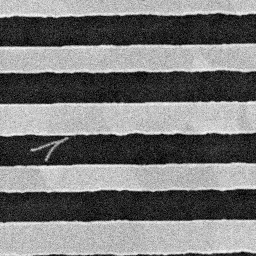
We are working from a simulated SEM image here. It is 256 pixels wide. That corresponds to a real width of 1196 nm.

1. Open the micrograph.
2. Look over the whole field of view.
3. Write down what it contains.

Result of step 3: lines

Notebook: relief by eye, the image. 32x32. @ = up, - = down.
@@@@@@@@@@@@@@@@@@@@@@@@@@@@@@@@
@@@@@@@@@@@@@@@@@@@@@@@@@@@@@@@@
--------------------------------
--------------------------------
--------------------------------
--------------------------------
@@@@@@@@@@@@@@@@@@@@@@@@@@@@@@@@
@@@@@@@@@@@@@@@@@@@@@@@@@@@@@@@@
@@@@@@@@@@@@@@@@@@@@@@@@@@@@@@@@
--------------------------------
--------------------------------
--------------------------------
--------------------------------
@@@@@@@@@@@@@@@@@@@@@@@@@@@@@@@@
@@@@@@@@@@@@@@@@@@@@@@@@@@@@@@@@
@@@@@@@@@@@@@@@@@@@@@@@@@@@@@@@@
@@@@@@@@@@@@@@@@@@@@@@@@@@@@@@@@
--------------------------------
--------------------------------
--------------------------------
----------------------------@@@-
@@@@@@@@@@@@@@@@@@@@@@@@@@@@@@@@
@@@@@@@@@@@@@@@@@@@@@@@@@@@@@@@@
@@@@@@@@@@@@@@@@@@@@@@@@@@@@@@@@
--------------------------------
--------------------------------
--------------------------------
---------------------------@----
@@@@@@@@@@@@@@@@@@@@@@@@@@@@@@@@
@@@@@@@@@@@@@@@@@@@@@@@@@@@@@@@@
@@@@@@@@@@@@@@@@@@@@@@@@@@@@@@@@
@@@@@@@@@@@@@@@@@@@@@@@@@@@@@--@